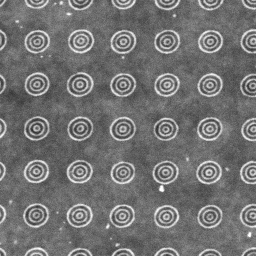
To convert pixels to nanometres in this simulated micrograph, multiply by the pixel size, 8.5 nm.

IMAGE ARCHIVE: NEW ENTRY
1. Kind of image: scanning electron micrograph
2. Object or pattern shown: a regular array of ring-shaped raised bodies with a dot in the middle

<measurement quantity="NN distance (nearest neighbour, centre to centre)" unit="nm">365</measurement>